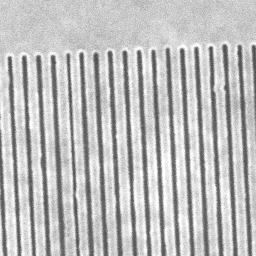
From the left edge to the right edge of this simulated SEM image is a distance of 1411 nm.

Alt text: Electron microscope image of parallel lines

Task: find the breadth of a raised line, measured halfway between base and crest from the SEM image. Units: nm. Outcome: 49.5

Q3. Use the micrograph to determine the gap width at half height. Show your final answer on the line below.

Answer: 29.6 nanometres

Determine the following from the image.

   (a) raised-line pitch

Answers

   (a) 79.3 nm